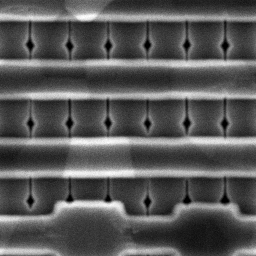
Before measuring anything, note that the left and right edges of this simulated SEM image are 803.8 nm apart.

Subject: wiring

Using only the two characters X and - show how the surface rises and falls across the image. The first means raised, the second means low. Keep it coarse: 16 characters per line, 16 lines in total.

XXXXXXXXXXXXXXXX
----------------
----------------
----------------
XXXXXXXXXXXXXXXX
XXXXXXXXXXXXXXXX
----------------
----------------
----------------
XXXXXXXXXXXXXXXX
XXXXXXXXXXXXXXXX
----------------
----------------
---XXXXX---XXXX-
XXXXXXXXXXXXXXXX
XXXXXXXXXXXXXXXX